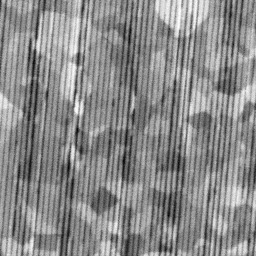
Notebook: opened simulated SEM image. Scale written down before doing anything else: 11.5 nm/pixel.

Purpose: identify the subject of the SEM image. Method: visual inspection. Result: parallel lines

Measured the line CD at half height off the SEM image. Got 41.7 nm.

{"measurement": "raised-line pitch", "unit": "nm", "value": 63.2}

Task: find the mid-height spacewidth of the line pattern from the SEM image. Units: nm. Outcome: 20.1